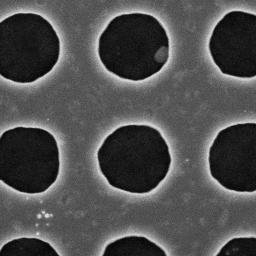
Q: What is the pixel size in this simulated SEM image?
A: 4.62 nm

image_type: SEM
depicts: holes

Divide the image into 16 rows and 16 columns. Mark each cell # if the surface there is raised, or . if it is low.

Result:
################
...####...####..
....##.....##...
....##.....##...
...####...####..
################
################
################
...####...####..
....##.....##...
....##.....##...
...####...####..
################
################
################
...####...####..